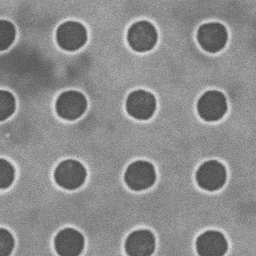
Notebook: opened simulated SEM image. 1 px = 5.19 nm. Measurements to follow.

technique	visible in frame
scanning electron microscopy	a regular array of holes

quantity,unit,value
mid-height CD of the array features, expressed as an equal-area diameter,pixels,31.9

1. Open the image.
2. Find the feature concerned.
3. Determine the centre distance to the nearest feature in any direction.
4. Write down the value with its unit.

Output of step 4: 361 nm